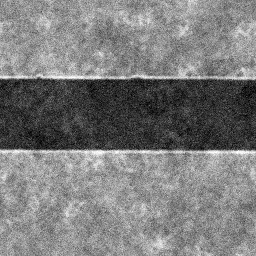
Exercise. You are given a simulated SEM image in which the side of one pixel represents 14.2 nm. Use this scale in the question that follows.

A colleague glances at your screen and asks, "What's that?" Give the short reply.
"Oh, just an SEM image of one or a few lines or trenches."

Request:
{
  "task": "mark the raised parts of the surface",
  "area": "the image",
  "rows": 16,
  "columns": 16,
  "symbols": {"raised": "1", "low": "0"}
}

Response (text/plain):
1111111111111111
1111111111111111
1111111111111111
1111111111111111
1111111111111111
0000000000000000
0000000000000000
0000000000000000
0000000000000000
1100000000000000
1111111111111111
1111111111111111
1111111111111111
1111111111111111
1111111111111111
1111111111111111